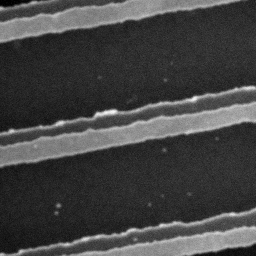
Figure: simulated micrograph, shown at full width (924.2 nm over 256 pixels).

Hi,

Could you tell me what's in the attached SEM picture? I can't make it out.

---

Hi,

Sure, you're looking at lines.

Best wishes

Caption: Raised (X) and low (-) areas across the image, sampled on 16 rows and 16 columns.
XXXXXXXXXXXX----
XXXXXX----------
X---------------
----------------
----------------
---------------X
----------XXXXXX
-----XXXXXXXXXXX
XXXXXXXXXXX-----
XXXXX-----------
----------------
----------------
----------------
--------------XX
--------XXXXXXXX
--XXXXXXXXXXXX--